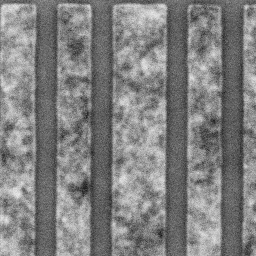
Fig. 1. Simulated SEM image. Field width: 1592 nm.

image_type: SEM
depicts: wiring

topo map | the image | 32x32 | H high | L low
LLLLLLLLLLLLLLLLLLLLLLLLLLLLLLLL
HHHHLLLHHHHLLLHHHHHHHLLLHHHLLLLH
HHHHLLLHHHHLLLHHHHHHHLLLHHHLLLLH
HHHHLLLHHHHLLLHHHHHHHLLLHHHLLLLH
HHHHLLLHHHHLLLHHHHHHHLLLHHHLLLLH
HHHHLLLHHHHLLLHHHHHHHLLLHHHLLLLH
HHHHLLLHHHHLLLHHHHHHHLLLHHHLLLLH
HHHHLLLHHHHLLLHHHHHHHLLLHHHLLLLH
HHHHLLLHHHHLLLHHHHHHHLLLHHHHLLLH
HHHHLLLHHHHLLLHHHHHHHLLLHHHHLLLH
HHHHLLLHHHHLLLHHHHHHHLLLHHHHLLLH
HHHHLLLHHHHLLLHHHHHHHLLLHHHLLLLH
HHHHLLLHHHHLLLHHHHHHHLLLHHHLLLLH
HHHHLLLHHHHLLLHHHHHHHLLLHHHLLLLH
HHHHLLLHHHHLLLHHHHHHHLLLHHHLLLLH
HHHHLLLHHHHLLLHHHHHHHLLLHHHLLLLH
HHHHLLLHHHHLLLHHHHHHHLLLHHHLLLLH
HHHHLLLHHHHLLLHHHHHHHLLLHHHLLLLH
HHHHLLLHHHHLLLHHHHHHHLLLHHHLLLLH
HHHHLLLHHHHLLLHHHHHHHLLLHHHHLLLH
HHHHLLLHHHHLLLHHHHHHHLLLHHHHLLLH
HHHHLLLHHHHLLLHHHHHHHLLLHHHLLLLH
HHHHLLLHHHHLLLHHHHHHLLLLHHHLLLLH
HHHHLLLHHHHLLLHHHHHHHLLLHHHLLLLH
HHHHLLLHHHHLLLHHHHHHHLLLHHHLLLLH
HHHHLLLHHHHLLLHHHHHHHLLLHHHLLLLH
HHHHLLLHHHHLLLHHHHHHHLLLHHHLLLLH
HHHHLLLHHHHLLLHHHHHHHLLLHHHLLLLH
HHHHLLLHHHHLLLHHHHHHHLLLHHHLLLHH
HHHHLLLHHHHLLLHHHHHHHLLLHHHLLLHH
HHHHLLLHHHHLLLHHHHHHLLLLHHHLLLHH
HHHHLLLHHHHLLLHHHHHHHLLLHHHLLLHH